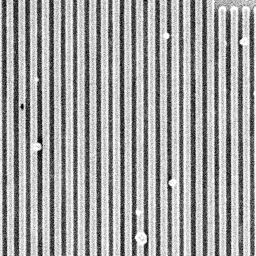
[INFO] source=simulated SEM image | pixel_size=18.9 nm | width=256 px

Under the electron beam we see parallel lines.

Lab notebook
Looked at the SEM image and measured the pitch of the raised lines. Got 223 nm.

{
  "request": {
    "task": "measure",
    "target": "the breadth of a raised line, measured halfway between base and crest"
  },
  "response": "113 nm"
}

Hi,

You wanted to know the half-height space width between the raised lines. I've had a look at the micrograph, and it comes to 113 nm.